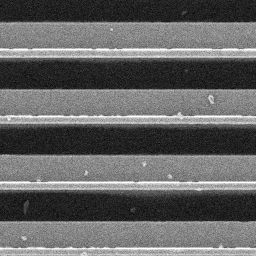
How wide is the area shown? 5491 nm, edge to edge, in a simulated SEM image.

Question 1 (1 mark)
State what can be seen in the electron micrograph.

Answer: lines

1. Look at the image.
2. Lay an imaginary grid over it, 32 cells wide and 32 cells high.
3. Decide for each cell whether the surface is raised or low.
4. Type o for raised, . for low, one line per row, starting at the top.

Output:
................................
................................
................................
oooooooooooooooooooooooooooooooo
oooooooooooooooooooooooooooooooo
oooooooooooooooooooooooooooooooo
oooooooooooooooooooooooooooooooo
................................
................................
................................
................................
oooooooooooooooooooooooooooooooo
oooooooooooooooooooooooooooooooo
oooooooooooooooooooooooooooooooo
oooooooooooooooooooooooooooooooo
...............oooooo..ooooooooo
................................
................................
................................
oo..............................
oooooooooooooooooooooooooooooooo
oooooooooooooooooooooooooooooooo
oooooooooooooooooooooooooooooooo
oooooooooooooooooooooooooooooooo
................................
................................
................................
................................
oooooooooooooooooooooooooooooooo
oooooooooooooooooooooooooooooooo
oooooooooooooooooooooooooooooooo
oooooooooooooooooooooooooooooooo